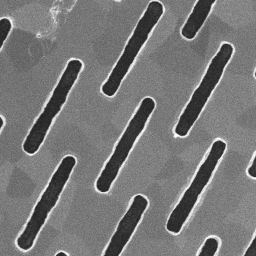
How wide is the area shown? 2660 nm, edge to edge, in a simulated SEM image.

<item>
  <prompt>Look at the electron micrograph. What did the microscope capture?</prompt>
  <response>holes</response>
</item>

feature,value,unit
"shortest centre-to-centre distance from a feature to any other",858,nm